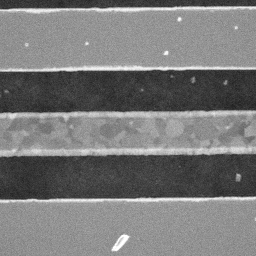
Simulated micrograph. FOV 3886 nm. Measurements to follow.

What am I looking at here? lines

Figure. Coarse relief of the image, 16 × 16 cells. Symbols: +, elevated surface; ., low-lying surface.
...........+++++
++++++++++++++++
++++++++++++++++
++++++++++++++++
................
................
................
++++++++++++++++
++++++++++++++++
++++++++++++++..
................
................
...+++++++++++++
++++++++++++++++
++++++++++++++++
++++++++++++++++